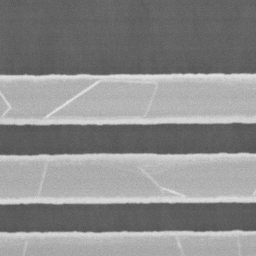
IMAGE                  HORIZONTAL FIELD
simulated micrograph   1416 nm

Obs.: lines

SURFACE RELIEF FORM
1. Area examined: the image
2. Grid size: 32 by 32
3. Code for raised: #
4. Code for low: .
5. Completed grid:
................................
................................
................................
................................
................................
................................
................................
................................
................................
......##########################
################################
################################
################################
################################
################################
................................
................................
................................
................................
....##.############.############
################################
################################
################################
################################
################################
................................
................................
................................
................................
################################
################################
################################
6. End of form